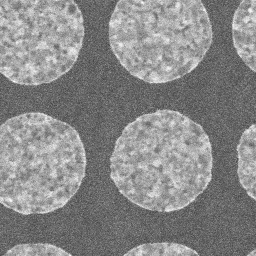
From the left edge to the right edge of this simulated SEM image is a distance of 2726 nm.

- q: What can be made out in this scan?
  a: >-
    raised bodies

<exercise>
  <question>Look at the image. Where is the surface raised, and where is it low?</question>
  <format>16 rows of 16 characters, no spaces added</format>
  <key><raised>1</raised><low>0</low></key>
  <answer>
1111100111111001
1111100111111001
1111100111111001
1111100111111001
1111000011110000
0000000000000000
0000000000000000
0111000001110000
1111100011111001
1111100111111001
1111100111111001
1111100111111001
1111000011110000
0000000000000000
0000000000000000
0111000011110000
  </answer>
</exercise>